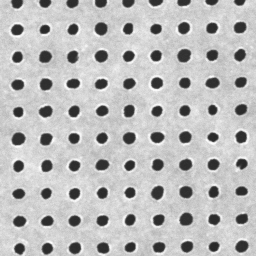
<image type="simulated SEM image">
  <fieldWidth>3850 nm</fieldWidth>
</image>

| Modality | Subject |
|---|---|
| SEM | a regular array of holes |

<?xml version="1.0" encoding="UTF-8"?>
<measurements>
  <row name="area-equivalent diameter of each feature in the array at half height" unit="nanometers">189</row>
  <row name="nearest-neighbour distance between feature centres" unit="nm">404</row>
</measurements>